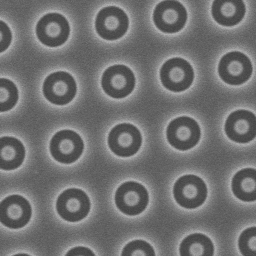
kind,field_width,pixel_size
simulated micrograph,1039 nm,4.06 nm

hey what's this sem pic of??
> an array of small figures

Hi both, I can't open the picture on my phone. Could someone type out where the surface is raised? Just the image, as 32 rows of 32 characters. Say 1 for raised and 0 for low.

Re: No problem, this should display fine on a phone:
11111111111111111111000111000001
11111111111100001110000111000001
11111000111100001110000111100011
01110000011100001111000111111111
00111000011100011111111111111111
01111000111111111111111111111111
11111111111111111111111111111011
11111111111111111111100111100001
11111111111110001111000011100000
11111100011110000111000011100001
00111000001110000111000011110011
00111000001110001111111111111111
00111100011111111111111111111111
00111111111111111111111111111111
11111111111111111111111111111000
11111111111111101111100001110000
11111110011111000011100001110000
00111100001110000011100001111000
00011100001111000011110011111111
00011100001111101111111111111111
00011111011111111111111111111111
11111111111111111111111111111100
11111111111111111111110001111000
11111111111111100011110000111000
10011110000111000001110000111000
00001110000111000011110001111111
00001110000111100011111111111111
00001111001111111111111111111111
10011111111111111111111111111110
11111111111111111111111000111100
11111111111111110001110000011100
11111111000011100001110000011100